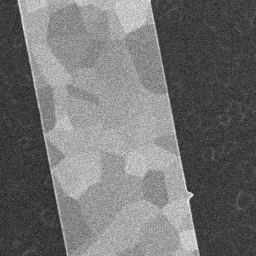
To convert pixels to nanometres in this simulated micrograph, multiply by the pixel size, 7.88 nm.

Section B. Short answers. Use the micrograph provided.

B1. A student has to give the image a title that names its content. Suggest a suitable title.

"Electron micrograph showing one or a few lines or trenches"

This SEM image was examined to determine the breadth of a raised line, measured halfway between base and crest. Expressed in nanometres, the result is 1020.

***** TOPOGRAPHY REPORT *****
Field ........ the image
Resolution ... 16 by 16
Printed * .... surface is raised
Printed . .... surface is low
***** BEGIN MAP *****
.********.......
.*********......
..********......
..********......
..********......
..********......
..*********.....
...********.....
...********.....
...********.....
...********.....
...*********....
....********....
....********....
....********....
....********....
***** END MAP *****